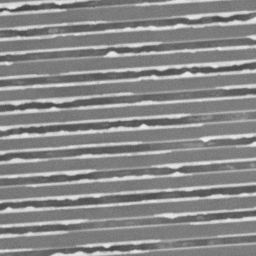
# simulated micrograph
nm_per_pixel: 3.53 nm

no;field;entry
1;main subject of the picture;parallel lines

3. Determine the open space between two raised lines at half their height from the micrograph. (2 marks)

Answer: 27.7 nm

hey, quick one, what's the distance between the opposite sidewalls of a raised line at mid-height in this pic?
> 0.0615 µm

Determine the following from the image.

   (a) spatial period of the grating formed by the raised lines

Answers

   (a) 0.087 micrometres